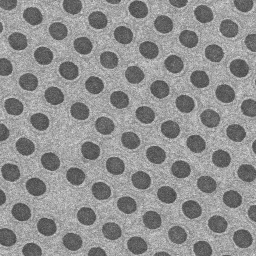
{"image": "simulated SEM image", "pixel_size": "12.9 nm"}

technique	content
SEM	a regular array of holes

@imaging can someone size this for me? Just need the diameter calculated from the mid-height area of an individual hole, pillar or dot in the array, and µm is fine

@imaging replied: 0.248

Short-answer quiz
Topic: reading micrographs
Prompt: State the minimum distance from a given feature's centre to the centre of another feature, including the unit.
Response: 374 nanometres